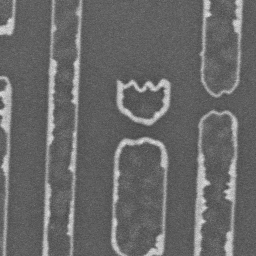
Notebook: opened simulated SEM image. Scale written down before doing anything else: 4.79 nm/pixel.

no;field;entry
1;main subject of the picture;one or a few lines or trenches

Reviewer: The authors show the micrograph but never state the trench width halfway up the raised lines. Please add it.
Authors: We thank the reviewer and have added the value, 186 nanometres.